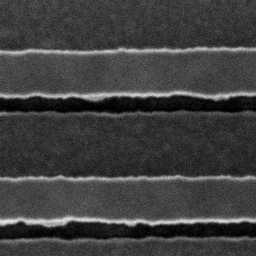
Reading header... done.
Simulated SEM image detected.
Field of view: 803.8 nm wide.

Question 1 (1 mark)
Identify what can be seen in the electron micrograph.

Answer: lines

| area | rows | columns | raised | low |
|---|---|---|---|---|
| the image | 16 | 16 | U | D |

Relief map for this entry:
DDDDDDDDDDDDDDDD
DDDDDDDDDDDDDDDD
DDDDDDDDDDDDDDDD
UUUUUUUUUUUUUUUU
UUUUUUUUUUUUUUUU
UUUUUUUUUUUUUUUU
DDDDDDDDDDDDDDDD
DDDDDDDDDDDDDDDD
DDDDDDDDDDDDDDDD
DDDDDDDDDDDDDDDD
DDDDDDDDDDDDDDDD
UUUUUUUUUUUUUUUU
UUUUUUUUUUUUUUUU
UUUUUUUUUUUUUUUU
DDDDDDDDDDDDDDDD
DDDDDDDDDDDDDDDD